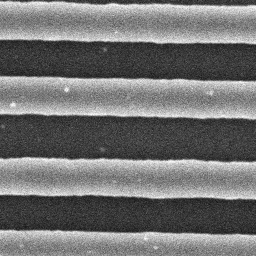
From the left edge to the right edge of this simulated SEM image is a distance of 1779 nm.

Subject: lines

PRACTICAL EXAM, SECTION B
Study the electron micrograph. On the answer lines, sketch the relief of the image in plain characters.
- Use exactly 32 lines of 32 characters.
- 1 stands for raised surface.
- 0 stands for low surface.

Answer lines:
11111111110000000000000000000000
11111111111111111111111111111111
11111111111111111111111111111111
11111111111111111111111111111111
11111111111111111111111111111111
00000000000000000000000000000000
00000000000000000000000000000000
00000000000000000000000000000000
00000000000000000000000000000000
00000000000000000000000000000000
11111111111111111111111111111111
11111111111111111111111111111111
11111111111111111111111111111111
11111111111111111111111111111111
00000000000000000000110111111111
00000000000000000000000000000000
00000000000000000000000000000000
00000000000000000000000000000000
00000000000000000000000000000000
00000000000000000000000000000000
11111111111111111111111111111111
11111111111111111111111111111111
11111111111111111111111111111111
11111111111111111111111111111111
00000000000000011111111111111111
00000000000000000000000000000000
00000000000000000000000000000000
00000000000000000000000000000000
00000000000000000000000000000000
11111111111111111111111111111110
11111111111111111111111111111111
11111111111111111111111111111111